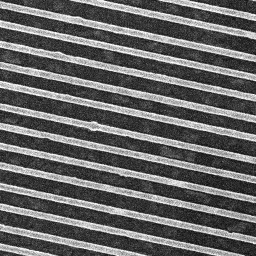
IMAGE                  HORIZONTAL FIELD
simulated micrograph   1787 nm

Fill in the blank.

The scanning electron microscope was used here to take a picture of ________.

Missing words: parallel lines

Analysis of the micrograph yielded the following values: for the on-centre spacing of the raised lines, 139 nanometres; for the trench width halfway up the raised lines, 96.4 nm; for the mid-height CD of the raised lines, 41 nm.